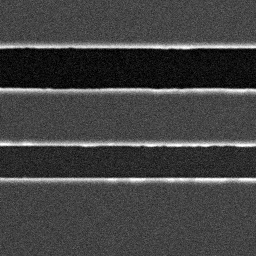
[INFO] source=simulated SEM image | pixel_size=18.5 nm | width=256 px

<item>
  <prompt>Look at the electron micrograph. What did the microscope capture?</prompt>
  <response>lines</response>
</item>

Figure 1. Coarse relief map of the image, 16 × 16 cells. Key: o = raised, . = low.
oooooooooooooooo
oooooooooooooooo
oooooooooooooooo
................
................
................
oooooooooooooooo
oooooooooooooooo
oooooooooooooooo
oooooooooooooooo
oooooooooooooooo
oooooooooooooooo
oooooooooooooooo
oooooooooooooooo
oooooooooooooooo
oooooooooooooooo